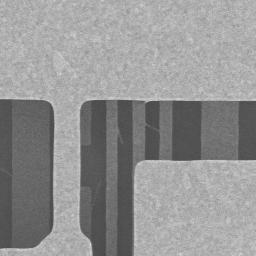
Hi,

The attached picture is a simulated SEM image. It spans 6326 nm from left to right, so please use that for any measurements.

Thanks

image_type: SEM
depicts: wiring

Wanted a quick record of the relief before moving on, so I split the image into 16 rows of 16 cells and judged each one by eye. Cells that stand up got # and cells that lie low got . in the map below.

################
################
################
################
################
################
...##...........
...##...........
...##...........
...##...........
...##....#######
...##...########
...##...########
...##...########
...##...########
..####..########